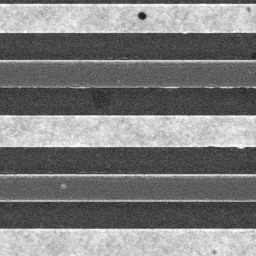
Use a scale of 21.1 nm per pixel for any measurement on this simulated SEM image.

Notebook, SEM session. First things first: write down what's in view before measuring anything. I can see lines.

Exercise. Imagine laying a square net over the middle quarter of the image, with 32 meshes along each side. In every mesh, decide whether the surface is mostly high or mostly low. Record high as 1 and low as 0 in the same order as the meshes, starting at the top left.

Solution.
11111111111111111111111111111111
11111111111111111111111111111111
11111111111111111111111111111111
11111111111111111111111111111111
11111111111111111111111111111111
11111111111111111111111111111111
00000000000000000000000000000000
00000000000000000000000000000000
00000000000000000000000000000000
00000000000000000000000000000000
00000000000000000000000000000000
00000000000000000000000000000000
00000000000000000000000000000000
11111111111111111111111111111111
11111111111111111111111111111111
11111111111111111111111111111111
11111111111111111111111111111111
11111111111111111111111111111111
11111111111111111111111111111111
11111111111111111111111111111111
11111111111111111111111111111111
00000000000000000000000000000000
00000000000000000000000000000000
00000000000000000000000000000000
00000000000000000000000000000000
00000000000000000000000000000000
00000000000000000000000000000000
00000000000000000000000000000000
11111111111111111111111111111111
11111111111111111111111111111111
11111111111111111111111111111111
11111111111111111111111111111111